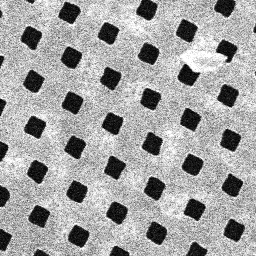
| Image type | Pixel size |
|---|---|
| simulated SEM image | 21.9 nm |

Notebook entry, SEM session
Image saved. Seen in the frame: a regular array of holes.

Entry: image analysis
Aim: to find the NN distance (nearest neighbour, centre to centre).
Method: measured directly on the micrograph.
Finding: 972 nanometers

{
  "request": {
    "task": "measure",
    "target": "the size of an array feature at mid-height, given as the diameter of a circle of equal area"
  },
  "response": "458 nanometers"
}